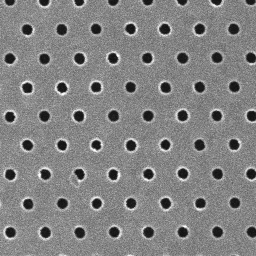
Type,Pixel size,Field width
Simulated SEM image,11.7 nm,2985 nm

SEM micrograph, a regular array of holes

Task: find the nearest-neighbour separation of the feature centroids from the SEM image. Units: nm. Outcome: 390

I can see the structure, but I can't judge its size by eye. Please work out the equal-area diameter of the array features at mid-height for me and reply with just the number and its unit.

11.1 pixels